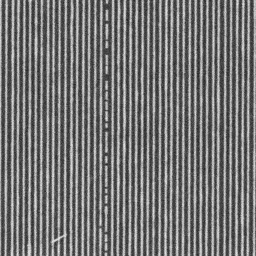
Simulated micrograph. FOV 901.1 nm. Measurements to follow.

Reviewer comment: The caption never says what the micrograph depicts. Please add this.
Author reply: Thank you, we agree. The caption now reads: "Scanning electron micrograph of parallel lines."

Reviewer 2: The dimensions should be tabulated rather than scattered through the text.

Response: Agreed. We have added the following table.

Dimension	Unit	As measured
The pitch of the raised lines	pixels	5.91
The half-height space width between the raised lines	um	0.0141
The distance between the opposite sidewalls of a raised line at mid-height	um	0.007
